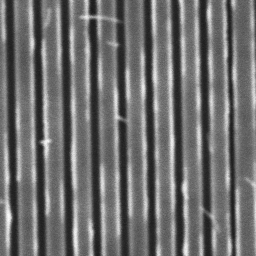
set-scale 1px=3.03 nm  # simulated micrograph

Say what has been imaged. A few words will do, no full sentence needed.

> parallel lines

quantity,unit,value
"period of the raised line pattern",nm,83.5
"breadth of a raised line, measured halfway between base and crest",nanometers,56.4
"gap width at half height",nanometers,26.9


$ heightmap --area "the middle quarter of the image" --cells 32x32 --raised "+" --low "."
..++++...++++...++++..+++++...++
..++++...++++...++++..+++++...++
..++++...++++...++++..+++++...++
..++++...++++...++++..+++++...++
..++++...++++...++++..+++++...++
..++++...++++...++++...++++...++
..++++...++++...++++...++++...++
..++++...++++...++++...++++...++
..++++...++++...++++...++++...++
..++++...++++...++++...++++...++
..++++...++++...++++...++++...++
..++++...++++...++++...++++...++
..++++...++++...++++...++++...++
..++++...+++++..++++...++++...++
..++++...++++..+++++...++++...++
..++++...++++...++++...++++...++
..++++...++++...++++...++++...++
..++++...++++...++++...++++...++
..++++...++++...++++...++++...++
..++++...++++...+++++..++++...++
..++++...++++...+++++..++++...++
..++++...+++++..+++++..++++...++
..++++...+++++..++++...++++...++
..++++...+++++..++++...++++...++
..++++...+++++..+++++..++++...++
..++++...+++++..+++++..++++...++
..+++++..+++++..+++++..++++...++
..+++++..+++++..++++...++++...++
..+++++..+++++..+++++..++++...++
..+++++..+++++..+++++..++++...++
..+++++..+++++..+++++..+++++..++
..+++++..+++++..+++++..+++++..++